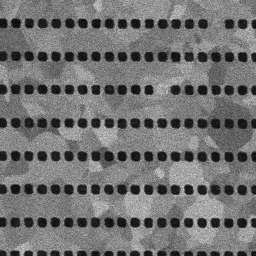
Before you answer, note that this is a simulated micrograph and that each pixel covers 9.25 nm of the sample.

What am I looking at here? a regular array of holes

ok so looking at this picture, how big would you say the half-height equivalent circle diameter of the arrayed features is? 0.0985 microns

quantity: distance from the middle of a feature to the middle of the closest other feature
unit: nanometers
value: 123